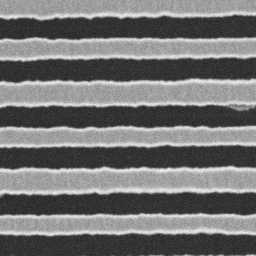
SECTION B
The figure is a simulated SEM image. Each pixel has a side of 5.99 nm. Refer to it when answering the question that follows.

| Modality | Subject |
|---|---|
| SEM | lines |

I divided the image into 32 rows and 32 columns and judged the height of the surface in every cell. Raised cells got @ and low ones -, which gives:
@@@@@@@@@@@@@@@@@@@@@@@@@@@@@@@@
@@@@@@@@@@@@@@@@@@@@@@@@@@@@@@@@
--------------------------------
--------------------------------
--------------------------------
@@@@@@@@@@@@@@@@@@@@@@@@@@@@@@@@
@@@@@@@@@@@@@@@@@@@@@@@@@@@@@@@@
@@@@----------------------------
--------------------------------
--------------------------------
@@@@@@@@@@@@@@@@@@@@@@@@@@@@@@@@
@@@@@@@@@@@@@@@@@@@@@@@@@@@@@@@@
@@@@@@@@@@@@@@@@@@@@@@@@@@@@@@@@
--------------------------------
--------------------------------
--------------------------------
@@@@@@@@@@@@@@@@@@@@@@@@@@@@@@@@
@@@@@@@@@@@@@@@@@@@@@@@@@@@@@@@@
--------------------------------
--------------------------------
--------------------------------
@@@@@@@@@@@@@@@@@@@@@@@@@@@@@@@@
@@@@@@@@@@@@@@@@@@@@@@@@@@@@@@@@
@@@@@@@@@@@@@@@@@@@@@@@@@@@@@@@@
--------------------------------
--------------------------------
--------------------------------
@@@@@@@@@@@@@@@@@@@@@@@@@@@@@@@@
@@@@@@@@@@@@@@@@@@@@@@@@@@@@@@@@
--------------------------------
--------------------------------
--------------------------------